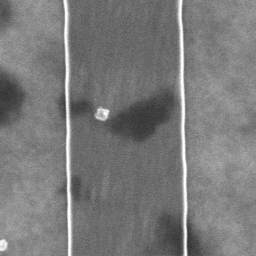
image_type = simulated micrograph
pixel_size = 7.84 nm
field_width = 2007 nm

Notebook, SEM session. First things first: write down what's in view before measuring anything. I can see wiring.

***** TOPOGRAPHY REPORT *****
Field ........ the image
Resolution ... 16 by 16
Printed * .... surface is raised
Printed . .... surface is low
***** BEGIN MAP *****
....*******.....
....*******.....
....*******.....
....*******.....
....*******.....
....*******.....
....********....
....********....
....********....
....********....
....********....
....********....
....********....
....********....
....********....
....********....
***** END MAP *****